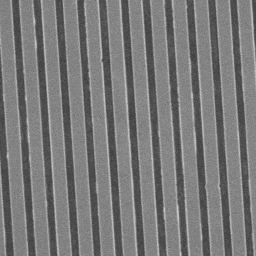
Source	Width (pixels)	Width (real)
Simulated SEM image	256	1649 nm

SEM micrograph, parallel lines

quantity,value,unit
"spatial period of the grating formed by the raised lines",0.14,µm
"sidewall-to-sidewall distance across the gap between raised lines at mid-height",53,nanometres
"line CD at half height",0.0875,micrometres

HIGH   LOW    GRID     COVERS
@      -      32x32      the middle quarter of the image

-@@@--@@@@--@@@--@@@---@@@--@@@-
-@@@--@@@@--@@@--@@@@--@@@--@@@@
-@@@--@@@@--@@@--@@@@--@@@--@@@@
-@@@--@@@@--@@@--@@@@--@@@--@@@@
-@@@---@@@--@@@---@@@--@@@---@@@
-@@@@--@@@--@@@---@@@--@@@---@@@
-@@@@--@@@--@@@---@@@--@@@---@@@
-@@@@--@@@--@@@---@@@--@@@---@@@
--@@@--@@@--@@@@--@@@--@@@---@@@
--@@@--@@@--@@@@--@@@--@@@@--@@@
--@@@--@@@--@@@@--@@@--@@@@--@@@
--@@@--@@@---@@@--@@@--@@@@--@@@
--@@@--@@@---@@@--@@@---@@@--@@@
--@@@--@@@---@@@--@@@---@@@--@@@
--@@@--@@@---@@@--@@@---@@@--@@@
--@@@--@@@---@@@--@@@---@@@--@@@
--@@@--@@@@--@@@--@@@@--@@@--@@@
--@@@--@@@@--@@@--@@@@--@@@--@@@
--@@@--@@@@--@@@--@@@@--@@@--@@@
--@@@---@@@--@@@---@@@--@@@--@@@
--@@@@--@@@--@@@---@@@--@@@---@@
--@@@@--@@@--@@@---@@@--@@@---@@
--@@@@--@@@--@@@---@@@--@@@---@@
---@@@--@@@--@@@@--@@@--@@@---@@
---@@@--@@@--@@@@--@@@--@@@@--@@
---@@@--@@@--@@@@--@@@--@@@@--@@
---@@@--@@@--@@@@--@@@--@@@@--@@
---@@@--@@@---@@@--@@@---@@@--@@
@--@@@--@@@---@@@--@@@---@@@--@@
@--@@@--@@@---@@@--@@@---@@@--@@
@--@@@--@@@---@@@--@@@---@@@--@@
@--@@@--@@@@--@@@--@@@@--@@@--@@